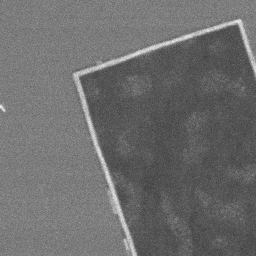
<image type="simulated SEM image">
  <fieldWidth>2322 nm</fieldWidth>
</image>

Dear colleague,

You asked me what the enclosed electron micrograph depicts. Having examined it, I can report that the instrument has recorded one or a few lines or trenches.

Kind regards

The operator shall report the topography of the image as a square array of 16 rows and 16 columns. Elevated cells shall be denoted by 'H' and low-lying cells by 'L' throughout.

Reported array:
LLLLLLLLLLLLLLLL
LLLLLLLLLLLLLLHL
LLLLLLLLLLLHHHHL
LLLLLLLLHHHHHHHH
LLLLLHHHHHHHHHHH
LLLLLHHHHHHHHHHH
LLLLLHHHHHHHHHHH
LLLLLLHHHHHHHHHH
LLLLLLHHHHHHHHHH
LLLLLLHHHHHHHHHH
LLLLLLLHHHHHHHHH
LLLLLLLHHHHHHHHH
LLLLLLLHHHHHHHHH
LLLLLLLLHHHHHHHH
LLLLLLLLHHHHHHHH
LLLLLLLLHHHHHHHH